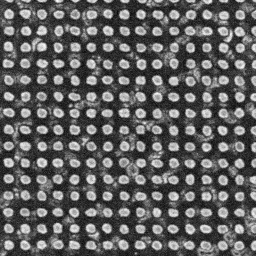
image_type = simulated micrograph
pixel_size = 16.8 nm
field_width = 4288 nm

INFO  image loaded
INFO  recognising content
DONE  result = a regular array of raised bodies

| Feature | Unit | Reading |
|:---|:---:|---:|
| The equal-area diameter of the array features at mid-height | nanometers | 141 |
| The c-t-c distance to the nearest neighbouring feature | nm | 268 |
